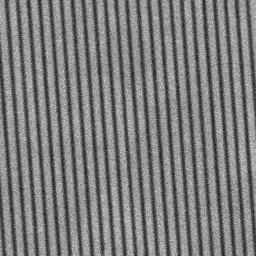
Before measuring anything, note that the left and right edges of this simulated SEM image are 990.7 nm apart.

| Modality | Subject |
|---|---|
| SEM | parallel lines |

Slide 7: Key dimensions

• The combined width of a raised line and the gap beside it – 42.2 nm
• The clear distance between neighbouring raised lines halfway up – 14.5 nm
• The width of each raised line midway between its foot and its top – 7.34 pixels